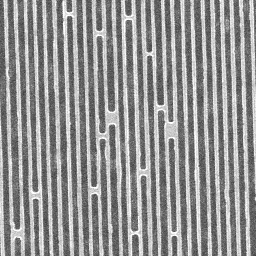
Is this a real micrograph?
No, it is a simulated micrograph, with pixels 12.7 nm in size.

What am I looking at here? parallel lines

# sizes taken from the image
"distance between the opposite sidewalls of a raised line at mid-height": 34.9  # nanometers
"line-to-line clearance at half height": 0.0873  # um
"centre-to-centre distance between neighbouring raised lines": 9.83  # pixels